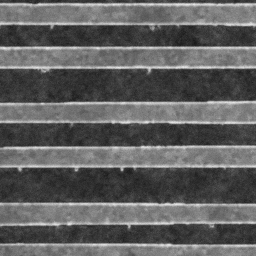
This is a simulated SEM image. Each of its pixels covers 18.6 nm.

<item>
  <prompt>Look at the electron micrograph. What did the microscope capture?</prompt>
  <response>lines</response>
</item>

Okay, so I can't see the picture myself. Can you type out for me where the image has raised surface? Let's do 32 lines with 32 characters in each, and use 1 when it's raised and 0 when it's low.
00000000000000000000000000000000
11111111111111111111111111111111
11111111111111111111111111111111
00000000000000000000000000000000
00000000000000000000000000000000
00000000000000000000000000000000
11111111111111111111111111111111
11111111111111111111111111111111
00000000000000000000000000000000
00000000000000000000000000000000
00000000000000000000000000000000
00000000000000000000000000000000
00000000000000000000000000000000
11111111111111111111111111111111
11111111111111111111111111111111
00000000000000000000000000000000
00000000000000000000000000000000
00000000000000000000000000000000
00011111111111111111111111111111
11111111111111111111111111111111
11111111111111111111111111111111
00000000000000000000000000000000
00000000000000000000000000000000
00000000000000000000000000000000
00000000000000000000000000000000
11111111111111000000000000000000
11111111111111111111111111111111
11111111111111111111111111111111
00000000000000000000000000000000
00000000000000000000000000000000
00000000000000000000000000000000
11111111111111111111111111111111